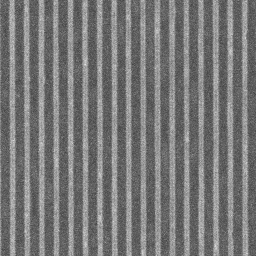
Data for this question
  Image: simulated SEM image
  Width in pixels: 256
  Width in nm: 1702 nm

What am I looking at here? parallel lines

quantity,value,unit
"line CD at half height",26.6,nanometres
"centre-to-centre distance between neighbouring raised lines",14.5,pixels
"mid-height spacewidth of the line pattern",69.8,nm